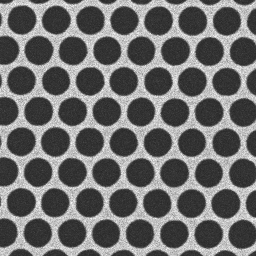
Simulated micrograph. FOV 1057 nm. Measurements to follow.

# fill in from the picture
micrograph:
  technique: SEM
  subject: a regular array of holes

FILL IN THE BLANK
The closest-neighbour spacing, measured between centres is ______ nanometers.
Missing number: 141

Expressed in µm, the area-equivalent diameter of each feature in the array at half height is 0.118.